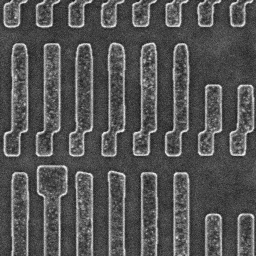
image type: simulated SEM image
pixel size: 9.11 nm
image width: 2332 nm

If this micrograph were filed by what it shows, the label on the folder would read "wiring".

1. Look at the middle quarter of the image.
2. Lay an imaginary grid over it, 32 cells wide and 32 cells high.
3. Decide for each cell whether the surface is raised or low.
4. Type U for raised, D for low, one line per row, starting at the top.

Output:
DDDUUUUDDDDUUUUDDDDDUUUDDDDDUUUD
DDDUUUUDDDDUUUUDDDDDUUUDDDDDUUUD
DDDUUUUDDDDUUUUDDDDDUUUDDDDDUUUD
DDDUUUUDDDDUUUUDDDDDUUUDDDDDUUUD
DDDUUUUDDDDUUUUDDDDDUUUDDDDDUUUD
DDDUUUUDDDDUUUUDDDDDUUUDDDDDUUUD
DDDUUUUDDDDUUUUDDDDDUUUDDDDDUUUD
DDDUUUUDDDDUUUUDDDDDUUUDDDDDUUUD
DDDUUUUDDDDUUUUDDDDDUUUDDDDDUUUD
DDDUUUUDDDDUUUUDDDDDUUUDDDDDUUUD
DDDUUUUDDDDUUUUDDDDDUUUDDDDDUUUD
DDDUUUUDDDDUUUUDDDDDUUUDDDDDUUUD
DDDUUUUDDDDUUUUDDDDDUUUDDDDDUUUD
DDDUUUUDDDDUUUUDDDDDUUUDDDDDUUUD
DDDUUUUDDDDUUUUDDDDDUUUDDDDDUUUD
DDDUUUUDDDDUUUUDDDDDUUUDDDDDUUUD
DDDUUUUDDDDUUUUDDDDUUUUDDDDUUUUD
DDUUUDDDDDUUUDDDDDUUUDDDDDUUUDDD
DDUUUDDDDDUUUDDDDDUUUDDDDDUUUDDD
DDUUUDDDDDUUUDDDDDUUUDDDDDUUUDDD
DDUUUDDDDDUUUDDDDDUUUDDDDDUUUDDD
DDUUUDDDDDUUUDDDDDUUUDDDDDUUUDDD
DDUUUDDDDDUUUDDDDDUUUDDDDDUUUDDD
DDDDDDDDDDDDDDDDDDDDDDDDDDDDDDDD
DDDDDDDDDDDDDDDDDDDDDDDDDDDDDDDD
DDDDDDDDDDDDDDDDDDDDDDDDDDDDDDDD
UDDDDDDDDDDDDDDDDDDDDDDDDDDDDDDD
UDDUUUDDDDDUUUDDDDDDUUUDDDDDUUUD
UDDUUUUDDDDUUUUDDDDDUUUDDDDDUUUD
UDDUUUUDDDDUUUUDDDDDUUUDDDDDUUUD
UDDUUUUDDDDUUUUDDDDDUUUDDDDDUUUD
UDDUUUUDDDDUUUUDDDDDUUUDDDDDUUUD